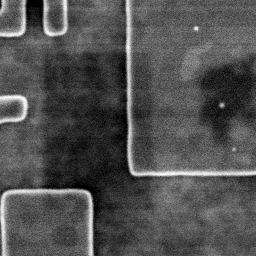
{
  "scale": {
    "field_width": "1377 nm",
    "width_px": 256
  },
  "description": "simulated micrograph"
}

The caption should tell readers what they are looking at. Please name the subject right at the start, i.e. wiring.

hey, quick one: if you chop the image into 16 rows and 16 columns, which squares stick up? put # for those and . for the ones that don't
##.#....########
##.#....########
........########
........########
........########
........########
##......########
#.......########
........########
........########
........########
................
######..........
######..........
######..........
######..........